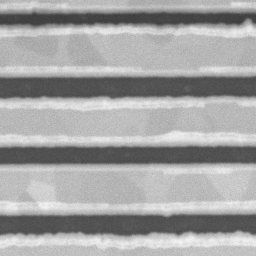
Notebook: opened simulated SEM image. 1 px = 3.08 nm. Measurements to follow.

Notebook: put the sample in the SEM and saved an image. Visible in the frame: one or a few lines or trenches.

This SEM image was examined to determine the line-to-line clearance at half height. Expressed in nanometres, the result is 73.2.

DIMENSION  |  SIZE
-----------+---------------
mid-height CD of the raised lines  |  0.138 um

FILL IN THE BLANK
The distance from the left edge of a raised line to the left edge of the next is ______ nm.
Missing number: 214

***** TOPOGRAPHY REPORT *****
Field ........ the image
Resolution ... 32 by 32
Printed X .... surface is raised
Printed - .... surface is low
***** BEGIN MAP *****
XXXXXXXXXXXXXXXXXXXXXXXXXXXXXXXX
--------------------------------
--------------------------------
-----XXXX-XXXXXXXXX-XXXXXXXX-XXX
XXXXXXXXXXXXXXXXXXXXXXXXXXXXXXXX
XXXXXXXXXXXXXXXXXXXXXXXXXXXXXXXX
XXXXXXXXXXXXXXXXXXXXXXXXXXXXXXXX
XXXXXXXXXXXXXXXXXXXXXXXXXXXXXXXX
XXXXXXXXXXXXXXXXXXXXXXXXXXXXXXXX
--------------------------------
--------------------------------
--------------------------------
----------------------XXX-XXXXXX
XXXXXXXXXXXXXXXXXXXXXXXXXXXXXXXX
XXXXXXXXXXXXXXXXXXXXXXXXXXXXXXXX
XXXXXXXXXXXXXXXXXXXXXXXXXXXXXXXX
XXXXXXXXXXXXXXXXXXXXXXXXXXXXXXXX
XXXXXXXXXXXXXXXXXXXXXXXXXXXXXXXX
--------------------------------
--------------------------------
--------------------------------
XXXXXXXXXXXXXXXXXXXXXXXXXXXXXXXX
XXXXXXXXXXXXXXXXXXXXXXXXXXXXXXXX
XXXXXXXXXXXXXXXXXXXXXXXXXXXXXXXX
XXXXXXXXXXXXXXXXXXXXXXXXXXXXXXXX
XXXXXXXXXXXXXXXXXXXXXXXXXXXXXXXX
--------------------------------
--------------------------------
--------------------------------
-----------------------X-----X--
XXXXXXXXXXXXXXXXXXXXXXXXXXXXXXXX
XXXXXXXXXXXXXXXXXXXXXXXXXXXXXXXX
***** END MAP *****